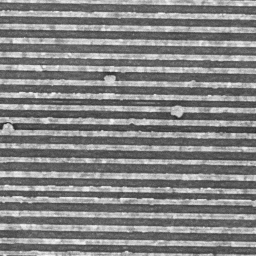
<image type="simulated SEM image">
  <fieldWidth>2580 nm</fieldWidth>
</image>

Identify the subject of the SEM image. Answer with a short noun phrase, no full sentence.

parallel lines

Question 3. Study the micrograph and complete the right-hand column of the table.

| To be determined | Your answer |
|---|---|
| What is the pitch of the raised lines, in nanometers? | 135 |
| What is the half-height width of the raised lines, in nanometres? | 47.9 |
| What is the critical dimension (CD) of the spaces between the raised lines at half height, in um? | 0.0907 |